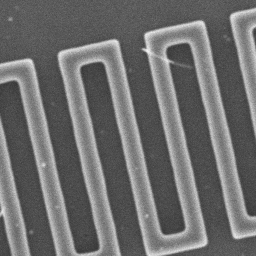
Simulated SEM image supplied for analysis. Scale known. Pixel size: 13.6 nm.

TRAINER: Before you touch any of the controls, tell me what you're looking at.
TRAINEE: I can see groups of lines, slits or small figures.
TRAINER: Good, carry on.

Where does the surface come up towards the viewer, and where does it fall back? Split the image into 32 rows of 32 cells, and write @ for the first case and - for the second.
--------------------------------
------------------------------@@
-----------------------------@@@
---------------------@@@@@---@@@
------------------@@@@@@@@---@@@
------------@@@---@@@@--@@----@@
--------@@@@@@@---@@@---@@----@@
-------@@@@@@@@----@@---@@@---@@
@@@@----@@---@@@---@@----@@---@@
@@@@@---@@---@@@---@@----@@---@@
--@@@---@@----@@---@@@---@@----@
---@@---@@@---@@----@@---@@----@
---@@----@@---@@----@@---@@@---@
---@@----@@---@@@---@@----@@---@
---@@@---@@----@@---@@----@@---@
---@@@---@@----@@---@@@---@@----
----@@---@@@---@@----@@---@@@---
@---@@----@@---@@@---@@----@@---
@---@@----@@---@@@---@@----@@---
@---@@@---@@----@@---@@@---@@---
@----@@---@@@---@@----@@---@@---
@----@@---@@@---@@----@@---@@@--
@@---@@----@@---@@@---@@----@@--
@@---@@----@@----@@---@@----@@--
@@---@@@---@@----@@---@@@---@@--
@@----@@---@@@---@@----@@---@@@-
@@@---@@----@@---@@@---@@---@@@-
-@@---@@----@@---@@@---@@----@@@
-@@---@@@---@@----@@---@@@---@@@
-@@----@@---@@----@@@@@@@@---@@-
-@@----@@---@@@---@@@@@@@@------
-@@@---@@@--@@@---@@@@----------